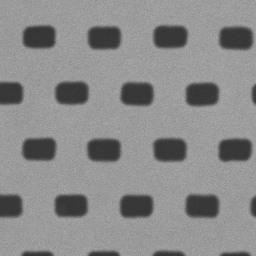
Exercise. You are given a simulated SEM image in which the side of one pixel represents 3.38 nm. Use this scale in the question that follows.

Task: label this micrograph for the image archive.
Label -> a regular array of holes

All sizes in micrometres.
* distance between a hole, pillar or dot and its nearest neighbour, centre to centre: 0.218